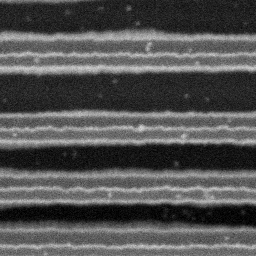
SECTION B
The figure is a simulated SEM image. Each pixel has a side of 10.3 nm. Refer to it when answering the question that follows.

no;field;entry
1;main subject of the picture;lines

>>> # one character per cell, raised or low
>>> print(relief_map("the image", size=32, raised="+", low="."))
................................
................................
................................
................................
................................
++++++++++++++++++++++++++++++++
++++++++++++++++++++++++++++++++
++++++++++++++++++++++++++++++++
++++++++++++.+++++++++++++++++++
................................
................................
................................
................................
................................
++++++++++++++++++++++++++++++++
++++++++++++++++++++++++++++++++
++++++++++++++++++++++++++++++++
++++++++++++++++++++++++++++++++
................................
................................
................................
................................
++++++++++++++++++++++++++++++++
++++++++++++++++++++++++++++++++
++++++++++++++++++++++++++++++++
................................
................................
................................
................................
++++++++++++++++++++++++++++++++
++++++++++++++++++++++++++++++++
++++++++++++++++++++++++++++++++